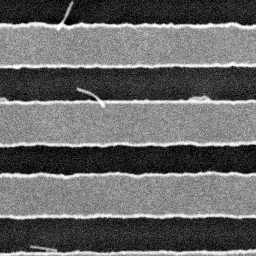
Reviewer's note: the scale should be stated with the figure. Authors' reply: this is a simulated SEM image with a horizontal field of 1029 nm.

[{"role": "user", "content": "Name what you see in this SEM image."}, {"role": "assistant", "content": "lines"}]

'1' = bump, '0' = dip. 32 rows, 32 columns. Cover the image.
00000000000000000000000000000000
00000000000000000000000000000000
00000000000000000000000000000000
11111111111111111111111111111111
11111111111111111111111111111111
11111111111111111111111111111111
11111111111111111111111111111111
11111111111111111111111111111111
01000000000000000000000000000000
00000000000000000000000000000000
00000000000000000000000000000000
00000000000000000000000000000000
00000000000000000000000000000000
11111111111111111111111111111111
11111111111111111111111111111111
11111111111111111111111111111111
11111111111111111111111111111111
11111111111111111111111111111111
00000000000000000000000000000000
00000000000000000000000000000000
00000000000000000000000000000000
00000000000000000000000000100000
11111111111111111111111111111111
11111111111111111111111111111111
11111111111111111111111111111111
11111111111111111111111111111111
11111111111111111111111111111111
00000000000000000000000000000000
00000000000000000000000000000000
00000000000000000000000000000000
00000000000000000000000000000000
00000000011100111111111111111111